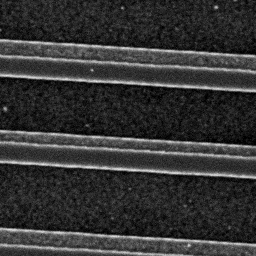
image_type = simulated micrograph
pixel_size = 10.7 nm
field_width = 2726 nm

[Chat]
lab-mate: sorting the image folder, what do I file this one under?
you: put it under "lines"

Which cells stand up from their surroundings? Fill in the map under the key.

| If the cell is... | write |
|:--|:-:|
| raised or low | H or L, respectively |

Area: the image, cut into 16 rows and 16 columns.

LLLLLLLLLLLLLLLL
LLLLLLLLLLLLLLLL
LLLLLLLLLLLLLLLL
HHHHHHHHHHHHHHHH
HHHHHHHHHHHHHHHH
LLLLLLLLLLLLLHHH
LLLLLLLLLLLLLLLL
LLLLLLLLLLLLLLLL
HHHHHLLLLLLLLLLL
HHHHHHHHHHHHHHHH
LLLLLLHHHHHHHHHH
LLLLLLLLLLLLLLLL
LLLLLLLLLLLLLLLL
LLLLLLLLLLLLLLLL
HHHHLLLLLLLLLLLL
HHHHHHHHHHHHHHHH